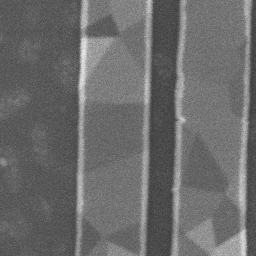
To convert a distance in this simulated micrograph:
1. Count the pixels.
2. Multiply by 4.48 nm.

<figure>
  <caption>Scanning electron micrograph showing one or a few lines or trenches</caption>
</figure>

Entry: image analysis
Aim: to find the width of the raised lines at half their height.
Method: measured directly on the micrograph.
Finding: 305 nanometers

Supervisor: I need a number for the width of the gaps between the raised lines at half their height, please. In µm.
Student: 0.129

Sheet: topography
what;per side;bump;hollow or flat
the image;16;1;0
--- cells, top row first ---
0000011110011111
0000011110011111
0000011110011111
0000011110011111
0000011110011111
0000011110011111
0000011110011111
0000011110011110
0000011110011110
0000011110011110
0000011110011110
0000011110011110
0000011110011110
0000011110011110
0000011110011110
0000011110011110